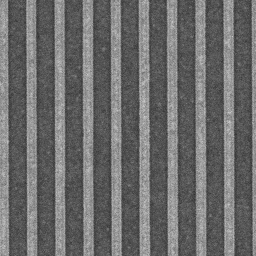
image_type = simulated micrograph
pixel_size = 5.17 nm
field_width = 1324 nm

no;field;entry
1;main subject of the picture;parallel lines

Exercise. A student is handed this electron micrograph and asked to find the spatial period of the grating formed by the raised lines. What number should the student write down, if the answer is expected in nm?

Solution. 146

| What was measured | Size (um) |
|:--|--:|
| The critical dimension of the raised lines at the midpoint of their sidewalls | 0.0478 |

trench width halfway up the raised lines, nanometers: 100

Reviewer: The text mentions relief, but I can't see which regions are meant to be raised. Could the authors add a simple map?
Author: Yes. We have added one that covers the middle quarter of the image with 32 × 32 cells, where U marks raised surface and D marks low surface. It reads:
DDDDDUUDDDDDUUDDDDDUUDDDDDUUDDDD
DDDDDUUDDDDDUUDDDDDUUDDDDDUUDDDD
DDDDDUUDDDDDUUDDDDDUUDDDDDUUDDDD
DDDDDUUDDDDDUUDDDDDUUDDDDDUUDDDD
DDDDDUUDDDDDUUDDDDDUUDDDDDUUDDDD
DDDDDUUDDDDDUUDDDDDUUDDDDDUUDDDD
DDDDDUUDDDDDUUDDDDDUUDDDDDUUDDDD
DDDDDUUDDDDDUUDDDDDUUDDDDDUUDDDD
DDDDDUUDDDDDUUDDDDDUUDDDDDUUDDDD
DDDDDUUDDDDDUUDDDDDUUDDDDDUUDDDD
DDDDDUUDDDDDUUDDDDDUUDDDDDUUDDDD
DDDDDUUDDDDDUUDDDDDUUDDDDDUUDDDD
DDDDDUUDDDDDUUDDDDDUUDDDDDUUDDDD
DDDDDUUDDDDDUUDDDDDUUDDDDDUUDDDD
DDDDDUUDDDDDUUDDDDDUUDDDDDUUDDDD
DDDDDUUDDDDDUUDDDDDUUDDDDDUUDDDD
DDDDDUUDDDDDUUDDDDDUUDDDDDUUDDDD
DDDDDUUDDDDDUUDDDDDUUDDDDDUUDDDD
DDDDDUUDDDDDUUDDDDDUUDDDDDUUDDDD
DDDDDUUDDDDDUUDDDDDUUDDDDDUUDDDD
DDDDDUUDDDDDUUDDDDDUUDDDDDUUDDDD
DDDDDUUDDDDDUUDDDDDUUDDDDDUUDDDD
DDDDDUUDDDDDUUDDDDDUUDDDDDUUDDDD
DDDDDUUDDDDDUUDDDDDUUDDDDDUUDDDD
DDDDDUUDDDDDUUDDDDDUUDDDDDUUDDDD
DDDDDUUDDDDDUUDDDDDUUDDDDDUUDDDD
DDDDDUUDDDDDUUDDDDDUUDDDDDUUDDDD
DDDDDUUDDDDDUUDDDDDUUDDDDDUUDDDD
DDDDDUUDDDDDUUDDDDDUUDDDDDUUDDDD
DDDDDUUDDDDDUUDDDDDUUDDDDDUUDDDD
DDDDDUUDDDDDUUDDDDDUUDDDDDUUDDDD
DDDDDUUDDDDDUUDDDDDUUDDDDDUUDDDD